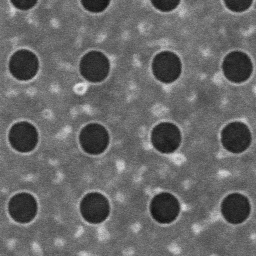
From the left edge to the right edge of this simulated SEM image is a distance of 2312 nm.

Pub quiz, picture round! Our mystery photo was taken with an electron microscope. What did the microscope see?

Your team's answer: a regular array of holes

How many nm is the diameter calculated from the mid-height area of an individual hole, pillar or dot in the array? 295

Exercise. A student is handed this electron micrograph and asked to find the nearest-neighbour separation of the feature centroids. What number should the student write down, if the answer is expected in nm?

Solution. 637